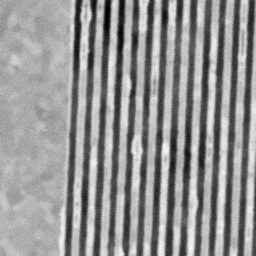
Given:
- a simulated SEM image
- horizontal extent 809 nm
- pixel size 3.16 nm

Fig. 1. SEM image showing parallel lines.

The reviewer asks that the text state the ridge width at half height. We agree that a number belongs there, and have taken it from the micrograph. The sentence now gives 0.0182 um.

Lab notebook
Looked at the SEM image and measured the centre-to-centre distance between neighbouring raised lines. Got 45.5 nanometres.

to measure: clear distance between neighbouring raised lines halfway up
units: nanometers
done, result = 26.9